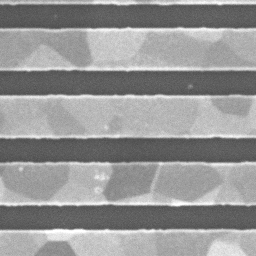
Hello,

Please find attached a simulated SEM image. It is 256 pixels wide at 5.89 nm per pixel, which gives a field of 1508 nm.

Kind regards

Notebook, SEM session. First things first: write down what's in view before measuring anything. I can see lines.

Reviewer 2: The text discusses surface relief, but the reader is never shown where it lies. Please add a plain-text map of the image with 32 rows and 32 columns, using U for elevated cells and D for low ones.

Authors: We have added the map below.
DDDDDDDDDDDDDDDDDDDDUUDDDDDDDDDD
DDDDDDDDDDDDDDDDDDDDDDDDDDDDDDDD
DDDDDDDDDDDDDDDDDDDDDDDDDDDDDDDD
DDDDDDDDDDDDDDDDDDDDDDDDDDDDDDDD
UUUUUUUUUUUUUUUUUUUUUUUUUUUUUUUU
UUUUUUUUUUUUUUUUUUUUUUUUUUUUUUUU
UUUUUUUUUUUUUUUUUUUUUUUUUUUUUUUU
UUUUUUUUUUUUUUUUUUUUUUUUUUUUUUUU
UUUUUUUUUUUUUUUUUUUUUUUUUUUUUUUU
DDDDDDDDDDDDDDDDDDDDDDDDDDDDDDDD
DDDDDDDDDDDDDDDDDDDDDDDDDDDDDDDD
DDDDDDDDDDDDDDDDDDDDDDDDDDDDDDDD
UUUUUUUUUUUUUUUUUUUUUUUUUUUUUUUU
UUUUUUUUUUUUUUUUUUUUUUUUUUUUUUUU
UUUUUUUUUUUUUUUUUUUUUUUUUUUUUUUU
UUUUUUUUUUUUUUUUUUUUUUUUUUUUUUUU
UUUUUUUUUUUUUUUUUUUUUUUUUUUUUUUU
DDDDDDDDDDDDDDDDDDDDDDDDDDDDDDDD
DDDDDDDDDDDDDDDDDDDDDDDDDDDDDDDD
DDDDDDDDDDDDDDDDDDDDDDDDDDDDDDDD
UUUUUUUUUUUUUUUUUUUUUUUUUUUUUUUU
UUUUUUUUUUUUUUUUUUUUUUUUUUUUUUUU
UUUUUUUUUUUUUUUUUUUUUUUUUUUUUUUU
UUUUUUUUUUUUUUUUUUUUUUUUUUUUUUUU
UUUUUUUUUUUUUUUUUUUUUUUUUUUUUUUU
UUUUUUUUUUUUUDDUUUUUUUUUUUUDDUUU
DDDDDDDDDDDDDDDDDDDDDDDDDDDDDDDD
DDDDDDDDDDDDDDDDDDDDDDDDDDDDDDDD
DDDDDDDDDDDDDDDDDDDDDDDDDDDDDDDD
UUUUUUUUUUUUUUUUUUUUUUUUUUUUUUUU
UUUUUUUUUUUUUUUUUUUUUUUUUUUUUUUU
UUUUUUUUUUUUUUUUUUUUUUUUUUUUUUUU